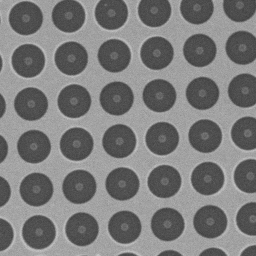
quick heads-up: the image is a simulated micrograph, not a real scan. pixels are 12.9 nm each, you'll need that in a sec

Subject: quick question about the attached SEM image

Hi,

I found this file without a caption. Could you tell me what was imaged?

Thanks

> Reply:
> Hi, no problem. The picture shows an array of small figures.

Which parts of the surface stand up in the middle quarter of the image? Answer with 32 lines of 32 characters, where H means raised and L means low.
LLLLLLHHHLLLLLLLHHHHLLLLLLHHHHHH
LLLLLHHHHHLLLLLHHHHHHHLLHHHHHHHH
LLLLHHHHHHHHHHHHHHHHHHHHHHHHHHHH
HHHHHHHHHHHHHHHHHHHHHHHHHHHHHHHH
HHHHHHHHHHHHLLLHHHHHHLLLLLHHHHHH
LLLLLHHHHHLLLLLLHHHHLLLLLLLHHHHL
LLLLLLHHHLLLLLLLLHHHLLLLLLLLHHLL
LLLLLLLHHLLLLLLLLHHLLLLLLLLLHHLL
LLLLLLLHHLLLLLLLLLHHLLLLLLLLHHHL
LLLLLLLHHLLLLLLLLHHHLLLLLLLLHHHL
LLLLLLLHHLLLLLLLLHHHLLLLLLLHHHHH
LLLLLLHHHHLLLLLLHHHHHHLLLLHHHHHH
LLLLLLHHHHHLLLLHHHHHHHHHHHHHHHHH
HLLLHHHHHHHHHHHHHHHHHHHHHHHHHHHH
HHHHHHHHHHHHHHHHHHHHHHHLLLHHHHHH
HHHHHHHHHHHHLLLLHHHHHHLLLLLLHHHH
HLLLLLHHHHHLLLLLLHHHHLLLLLLLHHHL
LLLLLLLHHHLLLLLLLLHHLLLLLLLLLHHL
LLLLLLLHHLLLLLLLLLHHLLLLLLLLLHHL
LLLLLLLLHLLLLLLLLLHHLLLLLLLLLHHL
LLLLLLLLHHLLLLLLLLHHHLLLLLLLLHHH
LLLLLLLHHHLLLLLLLLHHHLLLLLLLHHHH
LLLLLLLHHHHLLLLLLHHHHHLLLLLHHHHH
LLLLLLHHHHHHHLLHHHHHHHHHHHHHHHHH
HHHHHHHHHHHHHHHHHHHHHHHHHHHHHHHH
HHHHHHHHHHHHHHHHHHHHHHHLLLLHHHHH
HHHLLHHHHHHHLLLLLHHHHHLLLLLLHHHH
HLLLLLLHHHHLLLLLLLHHHLLLLLLLLHHH
LLLLLLLLHHHLLLLLLLLHHLLLLLLLLHHL
LLLLLLLLHHLLLLLLLLLHHLLLLLLLLLHH
LLLLLLLLHHLLLLLLLLLHHLLLLLLLLHHH
LLLLLLLLHHHLLLLLLLLHHLLLLLLLLHHH